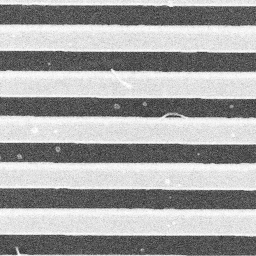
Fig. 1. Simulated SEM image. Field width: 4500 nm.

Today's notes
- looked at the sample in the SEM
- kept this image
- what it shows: lines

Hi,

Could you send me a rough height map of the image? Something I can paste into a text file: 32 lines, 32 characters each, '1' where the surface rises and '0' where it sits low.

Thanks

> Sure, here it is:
00000111111111111111111111111111
00000000000000000000000000000000
00000000000000000000000000000000
11111111111111111111111111111111
11111111111111111111111111111111
11111111111111111111111111111111
00000000000000000000000000000000
00000000000000000000000000000000
00000000000000000000000000000000
11111111111111111111111111111111
11111111111111111111111111111111
11111111111111111111111111111111
00000000000000000000000000000000
00000000000000000000000000000000
00000000000000000000000000000000
11111111111111111111111111111111
11111111111111111111111111111111
11111111111111111111111111111111
00000000000000000000000000000000
00000000000000000000000000000000
11000000000000000000000000000000
11111111111111111111111111111111
11111111111111111111111111111111
00000000011111111111111111111111
00000000000000000000000000000000
00000000000000000000000000000000
11111111111111111111111111111111
11111111111111111111111111111111
11111111111111111111111111111111
00000000000000000000000000000000
00000000000000000000000000000000
00000000000000000000000000000000